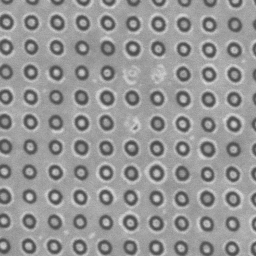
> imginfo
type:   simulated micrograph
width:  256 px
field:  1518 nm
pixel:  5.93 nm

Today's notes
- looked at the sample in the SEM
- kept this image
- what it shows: a regular array of ring-shaped grooves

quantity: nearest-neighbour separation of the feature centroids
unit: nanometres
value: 145